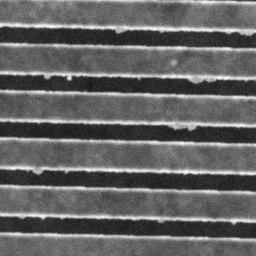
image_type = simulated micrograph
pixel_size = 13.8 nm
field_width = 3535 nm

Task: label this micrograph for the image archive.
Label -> lines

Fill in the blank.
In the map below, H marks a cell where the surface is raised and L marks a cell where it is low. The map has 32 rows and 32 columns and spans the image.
HHHHHHHHHHHHHHHHHHHHHHHHHHHHHHHH
HHHHHHHHHHHHHHHHHHHHHHHHHHHHHHHH
HHHHHHHHHHHHHHHHHHHHHHHHHHHHHHHH
LLLLLLLLLLHHHHHHHHHHHHHHHHHHHHHH
LLLLLLLLLLLLLLLLLLLLLLLLLLLLLLLL
HHHHLLLLLLLLLLLLLLLLLLLLLLLLLLLL
HHHHHHHHHHHHHHHHHHHHHHHHHHHHHHHH
HHHHHHHHHHHHHHHHHHHHHHHHHHHHHHHH
HHHHHHHHHHHHHHHHHHHHHHHHHHHHHHHH
LLLLLHLLLLLLLHLHHHHHHHHHHHHHHHHH
LLLLLLLLLLLLLLLLLLLLLLLLLLLLLLLL
HHHHHHLLLLLLLLLLLLLLLLLLLLLLLLLL
HHHHHHHHHHHHHHHHHHHHHHHHHHHHHHHH
HHHHHHHHHHHHHHHHHHHHHHHHHHHHHHHH
HHHHHHHHHHHHHHHHHHHHHHHHHHHHHHHH
LLLLLLLLLLLLLLLLLLHHHHHHHHHHHHHH
LLLLLLLLLLLLLLLLLLLLLLLLLLLLLLLL
HHHHHHHHHHLLLLLLLLLLLLLLLLLLLLLL
HHHHHHHHHHHHHHHHHHHHHHHHHHHHHHHH
HHHHHHHHHHHHHHHHHHHHHHHHHHHHHHHH
HHHHHHHHHHHHHHHHHHHHHHHHHHHHHHHH
LLLLHLLLLLLLLLLLLLLLLLHHHHHHHHHH
LLLLLLLLLLLLLLLLLLLLLLLLLLLLLLLL
HHHHHHHHHHHLLLLLLLLLLLLLLLLLLLLL
HHHHHHHHHHHHHHHHHHHHHHHHHHHHHHHH
HHHHHHHHHHHHHHHHHHHHHHHHHHHHHHHH
HHHHHHHHHHHHHHHHHHHHHHHHHHHHHHHH
LLLLLLLLLLLLLLLLLLLLLLLHHHHHHHHH
LLLLLLLLLLLLLLLLLLLLLLLLLLLLLLLL
HHHHHHHHHHHHHHHHHLLLLLLLLLLLLLLL
HHHHHHHHHHHHHHHHHHHHHHHHHHHHHHHH
HHHHHHHHHHHHHHHHHHHHHHHHHHHHHHHH